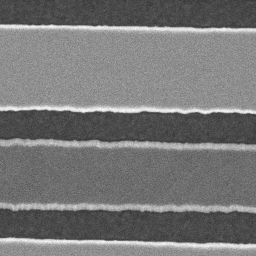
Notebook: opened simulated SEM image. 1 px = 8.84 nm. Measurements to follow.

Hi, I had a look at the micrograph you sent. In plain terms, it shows lines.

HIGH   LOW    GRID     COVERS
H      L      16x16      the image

LLLLLLLLLLLLLLLL
LLLLLLLLLLLLLLLL
HHHHHHHHHHHHHHHH
HHHHHHHHHHHHHHHH
HHHHHHHHHHHHHHHH
HHHHHHHHHHHHHHHH
HHHHHHHHHHHHHHHH
LLLLLLLLLLLLLLLL
LLLLLLLLLLLLLLLL
HHHHHHHHHHHHHHHH
HHHHHHHHHHHHHHHH
HHHHHHHHHHHHHHHH
HHHHHHHHHHHHHHHH
LLLLLLLLLLLLLLLL
LLLLLLLLLLLLLLLL
HHHHHHHHHHHHHHHH